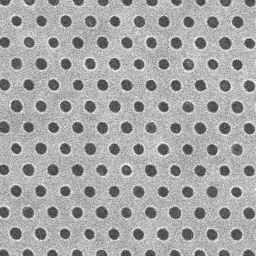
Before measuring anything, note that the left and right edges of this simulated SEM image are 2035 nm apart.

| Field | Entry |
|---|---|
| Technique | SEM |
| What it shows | a regular array of holes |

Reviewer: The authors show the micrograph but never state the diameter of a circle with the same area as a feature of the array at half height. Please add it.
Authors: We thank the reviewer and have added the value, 12.3 pixels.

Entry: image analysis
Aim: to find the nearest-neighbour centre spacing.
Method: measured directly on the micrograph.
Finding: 24.2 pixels